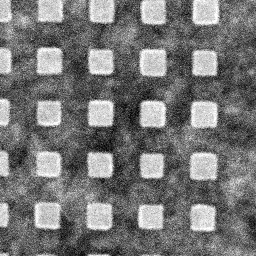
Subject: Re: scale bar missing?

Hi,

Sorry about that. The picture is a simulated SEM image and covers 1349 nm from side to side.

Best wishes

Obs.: a regular array of raised bodies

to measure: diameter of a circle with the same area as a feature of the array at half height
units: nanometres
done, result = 138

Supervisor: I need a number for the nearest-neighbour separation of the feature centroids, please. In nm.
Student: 271